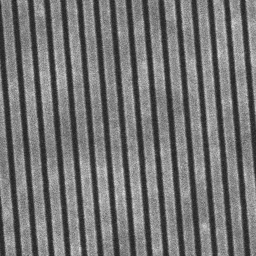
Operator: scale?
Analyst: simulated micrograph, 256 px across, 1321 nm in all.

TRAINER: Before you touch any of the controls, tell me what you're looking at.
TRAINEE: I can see parallel lines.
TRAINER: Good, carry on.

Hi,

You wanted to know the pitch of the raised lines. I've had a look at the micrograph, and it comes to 84 nm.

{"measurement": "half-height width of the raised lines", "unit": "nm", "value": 48.8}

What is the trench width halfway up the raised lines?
35.3 nanometres